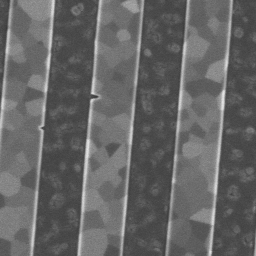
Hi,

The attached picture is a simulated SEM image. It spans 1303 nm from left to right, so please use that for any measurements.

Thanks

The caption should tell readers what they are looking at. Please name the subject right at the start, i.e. one or a few lines or trenches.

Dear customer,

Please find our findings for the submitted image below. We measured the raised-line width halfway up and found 221 nanometres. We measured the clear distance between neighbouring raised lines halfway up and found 231 nanometres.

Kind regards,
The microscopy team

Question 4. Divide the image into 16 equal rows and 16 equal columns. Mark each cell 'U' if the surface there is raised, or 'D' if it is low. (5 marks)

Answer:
DUUDDDUUUDDDUUDD
DUUDDDUUUDDDUUDD
UUUDDDUUUDDDUUDD
UUUDDDUUUDDUUUDD
UUUDDDUUUDDUUUDD
UUUDDDUUDDDUUUDD
UUUDDDUUDDDUUUDD
UUUDDDUUDDDUUUDD
UUUDDUUUDDDUUUDD
UUUDDUUUDDDUUUDD
UUDDDUUUDDDUUUDD
UUDDDUUUDDDUUUDD
UUDDDUUUDDDUUDDD
UUDDDUUUDDDUUDDD
UUDDDUUUDDDUUDDD
UUDDDUUUDDUUUDDD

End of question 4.